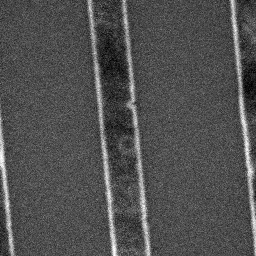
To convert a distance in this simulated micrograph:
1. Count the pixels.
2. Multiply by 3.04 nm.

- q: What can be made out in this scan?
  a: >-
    one or a few lines or trenches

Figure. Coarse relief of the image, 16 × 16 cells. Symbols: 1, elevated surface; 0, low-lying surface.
0000001100000001
0000001100000001
0000001100000001
0000001100000001
0000001100000001
0000001100000001
0000001100000001
0000001110000001
0000001110000001
0000001110000001
0000000110000000
0000000110000000
0000000110000000
1000000110000000
1000000110000000
1000000110000000